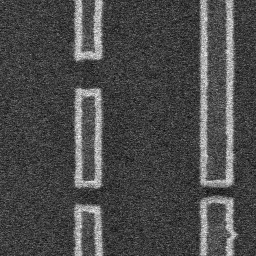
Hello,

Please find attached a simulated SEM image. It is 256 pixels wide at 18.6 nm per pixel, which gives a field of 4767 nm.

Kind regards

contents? one or a few lines or trenches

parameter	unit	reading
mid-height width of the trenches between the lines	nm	1980